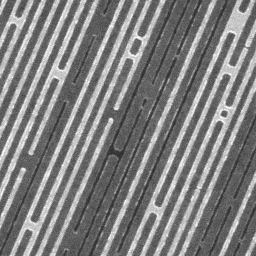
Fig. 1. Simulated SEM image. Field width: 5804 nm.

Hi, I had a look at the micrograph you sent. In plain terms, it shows parallel lines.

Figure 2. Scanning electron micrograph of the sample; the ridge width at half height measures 85.8 nanometres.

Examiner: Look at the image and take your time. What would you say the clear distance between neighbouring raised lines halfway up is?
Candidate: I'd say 8.26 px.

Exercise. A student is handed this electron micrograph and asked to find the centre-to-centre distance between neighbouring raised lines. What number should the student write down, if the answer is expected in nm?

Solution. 272